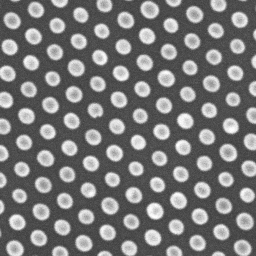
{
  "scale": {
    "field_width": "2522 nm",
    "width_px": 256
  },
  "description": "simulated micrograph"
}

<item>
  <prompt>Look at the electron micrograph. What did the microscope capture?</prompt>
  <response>a regular array of raised bodies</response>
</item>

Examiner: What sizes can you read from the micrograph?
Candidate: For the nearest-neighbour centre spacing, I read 0.256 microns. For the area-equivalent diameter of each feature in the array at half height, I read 145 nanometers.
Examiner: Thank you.